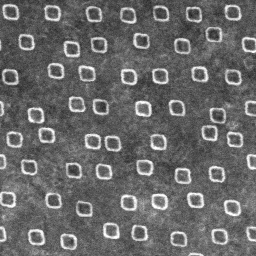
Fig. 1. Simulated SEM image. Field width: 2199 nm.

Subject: a regular array of raised bodies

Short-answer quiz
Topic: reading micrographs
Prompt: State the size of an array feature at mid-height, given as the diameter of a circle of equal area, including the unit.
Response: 134 nm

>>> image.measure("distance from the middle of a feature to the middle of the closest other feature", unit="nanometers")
259